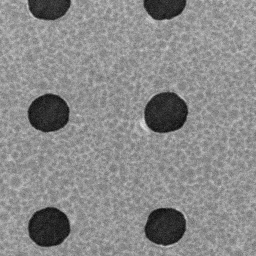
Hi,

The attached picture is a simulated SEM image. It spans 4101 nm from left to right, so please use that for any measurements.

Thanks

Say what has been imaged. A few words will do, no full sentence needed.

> holes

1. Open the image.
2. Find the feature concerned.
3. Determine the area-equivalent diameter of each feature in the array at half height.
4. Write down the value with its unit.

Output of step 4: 663 nanometers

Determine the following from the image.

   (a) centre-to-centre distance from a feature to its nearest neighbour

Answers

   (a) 1.83 µm